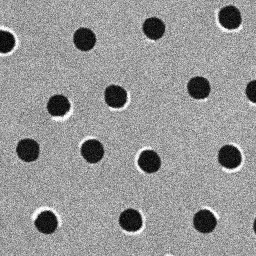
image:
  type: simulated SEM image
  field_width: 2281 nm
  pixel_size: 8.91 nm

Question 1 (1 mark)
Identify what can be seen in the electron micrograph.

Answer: a regular array of holes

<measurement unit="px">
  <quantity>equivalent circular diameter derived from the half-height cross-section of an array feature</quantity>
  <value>23.9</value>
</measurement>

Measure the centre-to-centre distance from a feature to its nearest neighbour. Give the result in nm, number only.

579